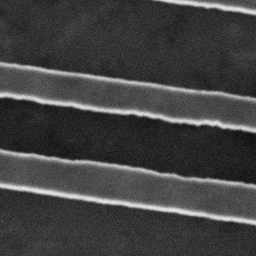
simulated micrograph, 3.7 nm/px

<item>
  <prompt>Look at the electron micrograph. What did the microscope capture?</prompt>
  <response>lines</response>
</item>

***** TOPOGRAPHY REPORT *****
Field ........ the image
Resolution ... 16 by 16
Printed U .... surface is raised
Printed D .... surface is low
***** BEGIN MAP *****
DDDDDDDDDDDDDDUU
DDDDDDDDDDDDDDDD
DDDDDDDDDDDDDDDD
DDDDDDDDDDDDDDDD
UUUUDDDDDDDDDDDD
UUUUUUUUUUUDDDDD
DDDUUUUUUUUUUUUU
DDDDDDDDDDUUUUUU
DDDDDDDDDDDDDDDD
UDDDDDDDDDDDDDDD
UUUUUUUUUDDDDDDD
UUUUUUUUUUUUUUUD
DDDDDUUUUUUUUUUU
DDDDDDDDDDDDUUUU
DDDDDDDDDDDDDDDD
DDDDDDDDDDDDDDDD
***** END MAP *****